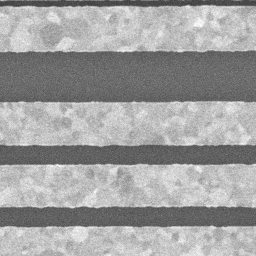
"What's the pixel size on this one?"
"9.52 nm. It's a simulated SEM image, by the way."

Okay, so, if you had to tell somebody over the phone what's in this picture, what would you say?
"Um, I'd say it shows lines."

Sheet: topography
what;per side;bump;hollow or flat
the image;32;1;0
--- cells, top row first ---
00000000000000000000000000000000
11111111111111111111111111111111
11111111111111111111111111111111
11111111111111111111111111111111
11111111111111111111111111111111
11111111111111111111111111111111
00100000000000000000000000000000
00000000000000000000000000000000
00000000000000000000000000000000
00000000000000000000000000000000
00000000000000000000000000000000
00000000000000000000000000000000
00000000000000000000000000000000
11111111111111111111111111111111
11111111111111111111111111111111
11111111111111111111111111111111
11111111111111111111111111111111
11111111111111111111111111111111
00000000000000000000000000000000
00000000000000000000000000000000
00000000000000000000000000000000
11111111111111111111111111111111
11111111111111111111111111111111
11111111111111111111111111111111
11111111111111111111111111111111
11111111111111111111111111111111
00000000000000000000000000000000
00000000000000000000000000000000
11000110111111111111011111101111
11111111111111111111111111111111
11111111111111111111111111111111
11111111111111111111111111111111